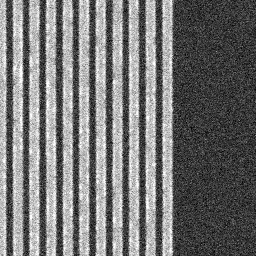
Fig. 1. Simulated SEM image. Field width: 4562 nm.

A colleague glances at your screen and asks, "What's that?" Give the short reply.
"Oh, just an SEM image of parallel lines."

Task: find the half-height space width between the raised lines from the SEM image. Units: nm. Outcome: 140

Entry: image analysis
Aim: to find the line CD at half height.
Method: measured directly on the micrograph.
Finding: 0.158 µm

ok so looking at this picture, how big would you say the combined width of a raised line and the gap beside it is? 0.296 micrometres